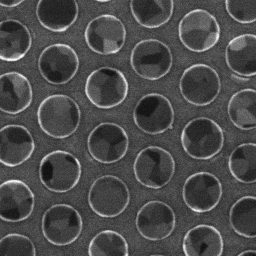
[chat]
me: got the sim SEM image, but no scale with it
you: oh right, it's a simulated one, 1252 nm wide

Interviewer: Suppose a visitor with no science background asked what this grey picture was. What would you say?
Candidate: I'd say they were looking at a regular array of raised bodies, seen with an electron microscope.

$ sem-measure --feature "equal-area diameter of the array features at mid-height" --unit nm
197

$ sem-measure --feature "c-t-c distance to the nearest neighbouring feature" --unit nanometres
259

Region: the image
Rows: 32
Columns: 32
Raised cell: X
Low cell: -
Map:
XX---XXXXX------XXXXXX------XXXX
-----XXXXX-------XXXX---XX---XXX
-----XXXX---XXX--XXXX--XXXX---XX
XXX---XX---XXXXX------XXXXX-----
XXXX-------XXXXX-------XXXX---XX
XXXX-------XXXX--XXX---XXXX--XXX
XXX--XXXX---XX---XXXX-------XXXX
-----XXXXX------XXXXX-------XXXX
-----XXXXX---X---XXXX---XX---XXX
XXX--XXXX--XXXX---XX---XXXX-----
XXXX-------XXXXX-------XXXX-----
XXXX-------XXXXX-------XXXX---XX
XXXX--XXX--XXXX---XXX--XXXX--XXX
XXX--XXXXX-------XXXX--------XXX
-----XXXXX-------XXXXX-------XXX
-----XXXXX---X---XXXX---XXX--XXX
XXX---XXX--XXXXX--XX---XXXXX----
XXXX-------XXXXX-------XXXXX----
XXXX-------XXXXX--XX---XXXXX--XX
XXXX--XXX---XXX--XXXX---XX---XXX
-X---XXXXX-------XXXXX-------XXX
-----XXXXX-------XXXXX-------XXX
-----XXXXX--XXX--XXXX--XXXX---XX
XXX---XXX--XXXXX---X---XXXXX----
XXXX-------XXXXX-------XXXXX----
XXXX-------XXXXX--XXX--XXXX--XXX
XXXX--XXXX--XXX--XXXXX-------XXX
-XX--XXXXX-------XXXXX-------XXX
-----XXXXX-------XXXXX--XXX--XXX
-XX---XXXX--XXX---XXX--XXXX----X
XXXX---X---XXXXX-------XXXXX----
XXXX-------XXXXX-------XXXXX---X